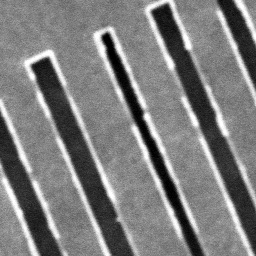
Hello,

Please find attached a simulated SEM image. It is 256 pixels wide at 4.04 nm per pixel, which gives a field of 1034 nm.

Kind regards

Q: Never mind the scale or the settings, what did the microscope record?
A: one or a few lines or trenches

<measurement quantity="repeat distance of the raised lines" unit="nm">263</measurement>